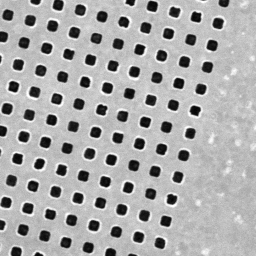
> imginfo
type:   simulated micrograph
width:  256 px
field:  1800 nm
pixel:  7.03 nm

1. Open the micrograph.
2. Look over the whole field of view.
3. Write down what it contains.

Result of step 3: a regular array of holes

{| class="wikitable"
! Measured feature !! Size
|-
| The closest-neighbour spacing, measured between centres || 22.2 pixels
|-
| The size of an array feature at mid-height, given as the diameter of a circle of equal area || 83.5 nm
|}